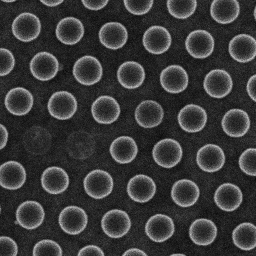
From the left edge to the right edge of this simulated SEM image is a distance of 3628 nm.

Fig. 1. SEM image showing a regular array of raised bodies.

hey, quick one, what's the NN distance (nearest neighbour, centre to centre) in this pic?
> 610 nm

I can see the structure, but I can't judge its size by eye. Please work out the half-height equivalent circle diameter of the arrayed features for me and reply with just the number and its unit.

388 nanometers